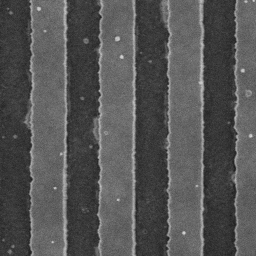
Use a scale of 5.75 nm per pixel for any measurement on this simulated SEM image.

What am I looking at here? lines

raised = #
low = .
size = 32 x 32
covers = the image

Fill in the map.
....####.....####....####....###
....####.....####....####....###
....####.....####....####....###
....####.....####....####.....##
....####....#####....####....###
....####.....####....####....###
....####....#####....####....###
....####....#####....####....###
....####....#####....####....###
....####....#####....####....###
....####....#####....####....###
....####.....####....####....###
....####....#####....####.....##
....####....#####....####....###
....####....#####....####....###
....####....#####....####....###
....####....#####....####.....##
....####.....####....####.....##
....####....#####....####....###
....####....#####....####....###
....####....#####....####....###
....####.....####....####....###
....####....#####....####....###
....####.....####....####....###
....####....#####....####....###
....####....#####....####....###
....####....#####....####....###
....####....#####....####.....##
....####....#####....####....###
....####....#####....####....###
....####....#####....####....###
....####....#####....####....###